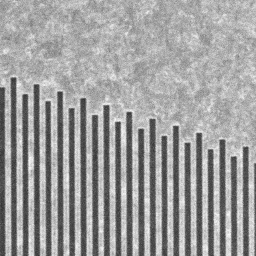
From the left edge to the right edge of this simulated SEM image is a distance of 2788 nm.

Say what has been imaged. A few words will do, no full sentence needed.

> parallel lines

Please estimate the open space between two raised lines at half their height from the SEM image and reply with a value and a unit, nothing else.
6.63 px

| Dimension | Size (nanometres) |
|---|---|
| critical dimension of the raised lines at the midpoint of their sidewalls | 51.7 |